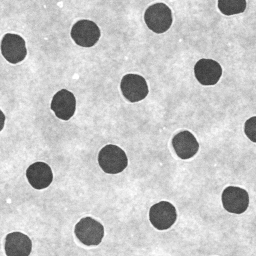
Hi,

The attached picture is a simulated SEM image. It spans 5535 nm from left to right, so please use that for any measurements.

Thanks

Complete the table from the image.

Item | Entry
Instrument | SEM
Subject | a regular array of holes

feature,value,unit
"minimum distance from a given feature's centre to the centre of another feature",1.59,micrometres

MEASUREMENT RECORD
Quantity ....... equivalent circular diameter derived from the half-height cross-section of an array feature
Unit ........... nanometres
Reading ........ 633